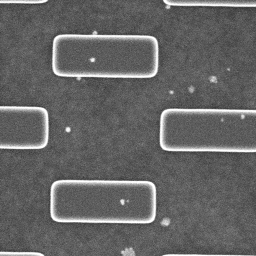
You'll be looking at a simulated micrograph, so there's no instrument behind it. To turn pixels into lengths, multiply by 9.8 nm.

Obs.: groups of lines, slits or small figures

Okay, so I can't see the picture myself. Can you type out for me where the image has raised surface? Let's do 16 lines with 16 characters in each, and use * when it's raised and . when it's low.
................
................
....******......
...*******......
....******......
................
................
***.......******
***.......******
................
................
....*****.......
...*******......
...*******......
................
................